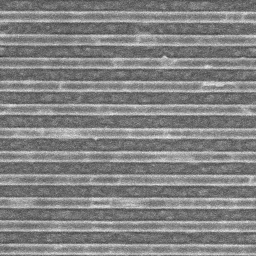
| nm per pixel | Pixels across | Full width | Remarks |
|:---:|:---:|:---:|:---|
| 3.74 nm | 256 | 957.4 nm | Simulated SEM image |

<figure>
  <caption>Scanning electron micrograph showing parallel lines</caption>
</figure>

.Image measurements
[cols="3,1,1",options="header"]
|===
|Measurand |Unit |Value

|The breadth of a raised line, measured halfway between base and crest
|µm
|0.0398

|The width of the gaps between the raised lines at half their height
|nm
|47.2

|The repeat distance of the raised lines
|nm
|87.1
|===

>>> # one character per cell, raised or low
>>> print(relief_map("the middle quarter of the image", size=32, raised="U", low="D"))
UUUUUUUUUUUUUUUUUUUUUUUUUUUUUUUU
DDDDDDDDDDDDDDDDDDDDDDDDDDDDDDDD
DDDDDDDDDDDDDDDDDDDDDDDDDDDDDDDD
DDDDDDDDDDDDDDDDDDDDDDDDDDDDDDDD
UUUUUUUUUUUUUUUUUUUUUUUUUUUUUUUU
UUUUUUUUUUUUUUUUUUUUUUUUUUUUUUUU
UUUUUUUUUUUUUUUUUUUUUUUUUUUUUUUU
DDDDDDDDDDDDDDDDDDDDDDDDDDDDDDDD
DDDDDDDDDDDDDDDDDDDDDDDDDDDDDDDD
DDDDDDDDDDDDDDDDDDDDDDDDDDDDDDDD
UUUUUUUUUUUUUUUUUUUUUUUUUUUUUUUU
UUUUUUUUUUUUUUUUUUUUUUUUUUUUUUUU
UUUUUUUUUUUUUUUUUUUUUUUUUUUUUUUU
DDDDDDDDDDDDDDDDDDDDDDDDDDDDDDDD
DDDDDDDDDDDDDDDDDDDDDDDDDDDDDDDD
DDDDDDDDDDDDDDDDDDDDDDDDDDDDDDDD
UUUUUUUUUUUUUUUUUUUUUUUUUUUUUUUU
UUUUUUUUUUUUUUUUUUUUUUUUUUUUUUUU
DDDDDDDUUDDDDDDDDDDDDDDDDDDDDDDD
DDDDDDDDDDDDDDDDDDDDDDDDDDDDDDDD
DDDDDDDDDDDDDDDDDDDDDDDDDDDDDDDD
DDDDDDDDDDDDDDDDDDDDDDDDDDDDDDDD
UUUUUUUUUUUUUUUUUUUUUUUUUUUUUUUU
UUUUUUUUUUUUUUUUUUUUUUUUUUUUUUUU
DDDDDDDDDDDDDDDDDDDDDDDDDDDDDDDD
DDDDDDDDDDDDDDDDDDDDDDDDDDDDDDDD
DDDDDDDDDDDDDDDDDDDDDDDDDDDDDDDD
DDDDDDDDDDDDDDDDDDDDDDDDDDDDDDDD
UUUUUUUUUUUUUUUUUUUUUUUUUUUUUUUU
UUUUUUUUUUUUUUUUUUUUUUUUUUUUUUUU
DDDDDDDDDDDDDDDDDDDDDDDDDDDDDDDD
DDDDDDDDDDDDDDDDDDDDDDDDDDDDDDDD